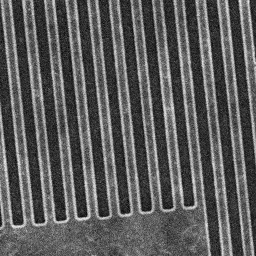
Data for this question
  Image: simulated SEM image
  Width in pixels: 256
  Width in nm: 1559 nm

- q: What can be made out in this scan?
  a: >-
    parallel lines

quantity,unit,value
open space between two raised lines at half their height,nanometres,78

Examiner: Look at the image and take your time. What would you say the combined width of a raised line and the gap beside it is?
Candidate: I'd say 0.131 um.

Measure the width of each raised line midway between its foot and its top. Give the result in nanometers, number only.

55.2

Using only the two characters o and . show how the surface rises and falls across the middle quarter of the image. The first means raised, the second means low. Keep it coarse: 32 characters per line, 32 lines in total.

..oo....oo...oo...ooo...oo...ooo
..ooo...oo...oo....oo...oo....oo
...oo...oo...oo....oo...oo....oo
...oo...oo...ooo...oo...oo....oo
...oo...oo....oo...oo...ooo...oo
...oo...ooo...oo...oo...ooo...oo
...oo....oo...oo...oo....oo...oo
...oo....oo...oo...oo....oo...oo
...oo....oo...oo...oo....oo...oo
...oo....oo...oo...ooo...oo...oo
...ooo...oo...oo...ooo...oo....o
....oo...oo...oo....oo...oo....o
....oo...oo...ooo...oo...oo....o
....oo...oo....oo...oo...oo....o
....oo...oo....oo...oo...ooo...o
o...oo...ooo...oo...oo....oo...o
o...oo....oo...oo...oo....oo...o
o...oo....oo...oo...oo....oo...o
o...oo....oo...oo...oo....oo...o
o...oo....oo...oo...ooo...oo...o
o...ooo...oo...oo....oo...oo....
o....oo...oo...oo....oo...oo....
o....oo...oo...ooo...oo...oo....
o....oo...oo....oo...oo...oo....
o....oo...ooo...oo...oo...ooo...
oo...oo...ooo...oo...oo....oo...
oo...oo....oo...oo...oo....oo...
oo...oo....oo...oo...oo....oo...
oo...oo....oo...oo...oo....oo...
oo...ooo...oo...oo...ooo...oo...
oo...ooo...oo...oo....oo...oo...
oo....oo...oo...ooo...oo...oo...